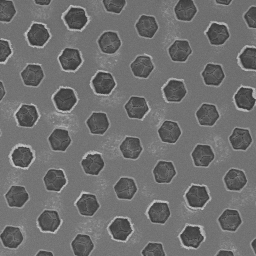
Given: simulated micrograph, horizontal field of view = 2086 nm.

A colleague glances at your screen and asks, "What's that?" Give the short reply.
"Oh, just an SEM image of a regular array of holes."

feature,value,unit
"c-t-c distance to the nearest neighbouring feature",0.33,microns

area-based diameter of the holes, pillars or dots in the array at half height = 180 nm